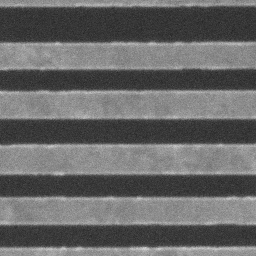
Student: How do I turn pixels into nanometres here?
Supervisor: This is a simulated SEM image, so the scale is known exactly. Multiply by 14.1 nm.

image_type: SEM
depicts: lines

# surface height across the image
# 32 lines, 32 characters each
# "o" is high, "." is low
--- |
oooooooooooooooooooooooooooooooo
................................
................................
................................
................................
oooooooooooooooooooooooooooooooo
oooooooooooooooooooooooooooooooo
oooooooooooooooooooooooooooooooo
ooooooooooooooooooooooo...ooo...
................................
................................
.....o...ooooooooooooooooooooooo
oooooooooooooooooooooooooooooooo
oooooooooooooooooooooooooooooooo
oooooooooooooooooooooooooooooooo
................................
................................
................................
oooooooooooooooooooooooooooooooo
oooooooooooooooooooooooooooooooo
oooooooooooooooooooooooooooooooo
oooooooooooooooooooooooooooooooo
................................
................................
................................
oooooooooooooooooooooooooooooooo
oooooooooooooooooooooooooooooooo
oooooooooooooooooooooooooooooooo
................................
................................
................................
oooooooooooooooooooooooooooooooo